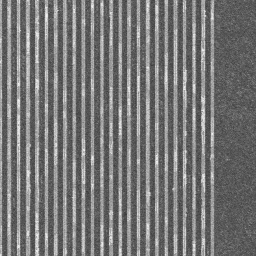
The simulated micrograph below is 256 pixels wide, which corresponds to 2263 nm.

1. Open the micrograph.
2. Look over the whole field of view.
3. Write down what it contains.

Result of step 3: parallel lines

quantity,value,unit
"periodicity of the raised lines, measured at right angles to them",82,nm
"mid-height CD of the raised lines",25.4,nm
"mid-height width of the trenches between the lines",58.6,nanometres